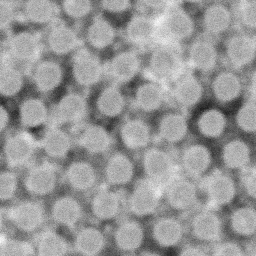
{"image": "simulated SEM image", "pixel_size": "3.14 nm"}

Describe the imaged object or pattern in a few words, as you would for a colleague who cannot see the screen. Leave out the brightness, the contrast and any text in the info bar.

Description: a regular array of raised bodies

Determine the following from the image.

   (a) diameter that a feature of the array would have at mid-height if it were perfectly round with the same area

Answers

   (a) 79.7 nm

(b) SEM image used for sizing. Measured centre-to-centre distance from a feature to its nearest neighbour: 0.121 microns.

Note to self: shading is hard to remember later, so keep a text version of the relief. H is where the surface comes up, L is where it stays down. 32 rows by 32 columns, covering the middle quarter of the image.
LLLHHHHHHLLLHHHHHHHLLLHHHHHHLLLL
LLHHHHHHHLLLHHHHHHLLLLLHHHHLLLLL
LLLHHHHHHLLLLHHHHHLLLLLLLLLLLLLL
LLLHHHHHLLLLLLHHLLLLLLLLLLLLLLLL
LLLLHHHLLLLLLLLLLLLLLLLLLLLLLLHH
LLLLLLLLLLLLLLLLLLLLHHHLLLLLHHHH
LLLLLLLLLLLHLLLLLLLHHHHHLLLLHHHH
LLLLLLLLLHHHHHLLLLHHHHHHLLLLHHHH
HHHHLLLLLHHHHHHLLLHHHHHHLLLLHHHH
HHHHHLLLLHHHHHHLLLHHHHHHLLLLLHHH
HHHHHLLLLHHHHHLLLLLHHHHLLLLLLLLL
HHHHHLLLLHHHHHLLLLLLLLLLLLLLLLLL
HHHHHLLLLLHHHLLLLLLLLLLLLLLLLLLL
HHHHLLLLLLLLLLLLLLLLLLLLLHHHHLLL
LLLLLLLLLLLLLLLLLHHLLLLLLHHHHHLL
LLLLLLLLLLLLLLLLHHHHLLLLHHHHHHLL
LLLLLLHHHHLLLLLHHHHHHLLLHHHHHHLL
LLLLLHHHHHHLLLLHHHHHHLLLHHHHHHLL
HLLLLHHHHHHLLLLHHHHHHLLLLHHHHLLL
HLLLLHHHHHHLLLLHHHHHLLLLLLLLLLLL
HLLLLHHHHHHLLLLLHHLLLLLLLLLLLLLL
HLLLLLHHHLLLLLLLLLLLLLLLLLLLLLLH
LLLLLLLLLLLLLLLLLLLLLLHHHLLLLLLH
LLLLLLLLLLLLLHHLLLLLLHHHHHLLLLHH
LLLLLLLLLLLLHHHHLLLLHHHHHHHLLLHH
LLHHHHLLLLLHHHHHHLLLHHHHHHHLLLLH
LHHHHHHLLLLHHHHHHLLLLHHHHHLLLLLH
LHHHHHHLLLLHHHHHHLLLLLHHHHLLLLLL
LHHHHHHLLLLHHHHHHLLLLLLLLLLLLLLL
LLHHHHHLLLLLLHLLLLLLLLLLLLLLLLLL
LLLHHHLLLLLLLLLLLLLLLLLLLLLLHHHH
LLLLLLLLLLLLLLLLLLLHHHLLLLLHHHHH